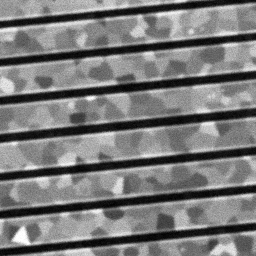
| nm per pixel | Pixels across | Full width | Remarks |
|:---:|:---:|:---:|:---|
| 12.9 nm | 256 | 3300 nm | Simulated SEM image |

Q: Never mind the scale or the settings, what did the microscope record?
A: parallel lines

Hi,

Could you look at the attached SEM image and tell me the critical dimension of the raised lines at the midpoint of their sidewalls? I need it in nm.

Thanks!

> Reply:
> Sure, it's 361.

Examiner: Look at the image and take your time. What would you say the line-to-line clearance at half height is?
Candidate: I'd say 9.7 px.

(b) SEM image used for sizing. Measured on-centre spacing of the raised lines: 488 nm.